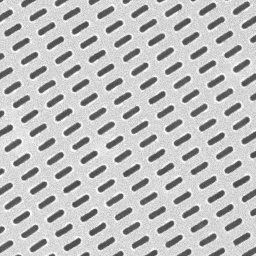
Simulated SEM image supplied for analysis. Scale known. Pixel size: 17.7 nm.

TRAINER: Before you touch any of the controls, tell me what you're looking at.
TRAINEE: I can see a regular array of holes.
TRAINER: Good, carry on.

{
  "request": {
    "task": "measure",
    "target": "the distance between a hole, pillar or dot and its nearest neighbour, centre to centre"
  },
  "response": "292 nm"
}